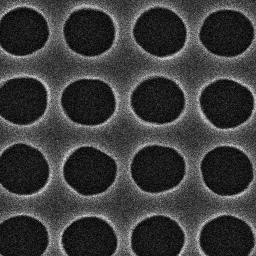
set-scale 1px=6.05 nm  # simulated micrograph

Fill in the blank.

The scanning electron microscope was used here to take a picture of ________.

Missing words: a regular array of holes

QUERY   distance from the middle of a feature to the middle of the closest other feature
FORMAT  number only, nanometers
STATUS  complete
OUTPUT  411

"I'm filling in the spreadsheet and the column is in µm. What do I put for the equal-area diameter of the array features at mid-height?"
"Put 0.313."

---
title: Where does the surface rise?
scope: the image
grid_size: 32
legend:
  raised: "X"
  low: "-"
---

XXXXXXXXXXXXXXXXXXXXXXXXXXXXXXXX
X----XXXX----XXXXX----XXXXX---XX
------XX------XXX------XXX-----X
------XX------XXX------XX-------
------XX------XXX------XX-------
------XX------XXX------XX------X
X---XXXXX----XXXXX----XXXX-----X
XXXXXXXXXXXXXXXXXXXXXXXXXXXXXXXX
XXXXXXXXXXXXXXXXXXXXXXXXXXXXXXXX
XXXXXXXXXXXXXXXXXXX-XXXXXXXXXXXX
-----XXXX----XXXX-----XXXX----XX
------XX------XX-------XX------X
------XX------XX-------XX-------
------XX------XX-------XX-------
-----XXX------XXX------XXX-----X
XX--XXXXX----XXXXXX--XXXXXX---XX
XXXXXXXXXXXXXXXXXXXXXXXXXXXXXXXX
XXXXXXXXXXXXXXXXXXXXXXXXXXXXXXXX
X----XXXXX--XXXXXX----XXXXX---XX
-----XXXX-----XXX------XXX-----X
------XX-------X-------XX-------
------XX-------X-------XX-------
------XX------XXX------XX-------
X----XXXX-----XXX-----XXXX-----X
XXXXXXXXXXXXXXXXXXXXXXXXXXXXXXXX
XXXXXXXXXXXXXXXXXXXXXXXXXXXXXXXX
XXXXXXXXXXXXXXXXXXXXXXXXXXXXXXXX
X----XXXXX---XXXXX----XXXX----XX
------XX------XXX------XX------X
------XX-------X-------XX-------
------XX-------X-------XX-------
------XX------XXX-----XXX------X